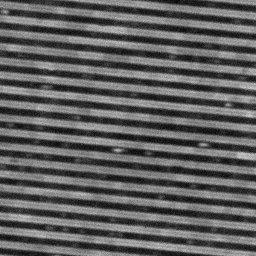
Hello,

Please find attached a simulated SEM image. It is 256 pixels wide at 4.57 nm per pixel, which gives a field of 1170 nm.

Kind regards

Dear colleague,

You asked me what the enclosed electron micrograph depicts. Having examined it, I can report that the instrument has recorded parallel lines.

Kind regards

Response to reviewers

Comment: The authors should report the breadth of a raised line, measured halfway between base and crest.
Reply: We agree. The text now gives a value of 0.0261 µm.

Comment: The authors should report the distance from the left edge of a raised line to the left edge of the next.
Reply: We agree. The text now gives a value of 64.1 nanometres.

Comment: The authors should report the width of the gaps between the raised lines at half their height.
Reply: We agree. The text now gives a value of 8.45 px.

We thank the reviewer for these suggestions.